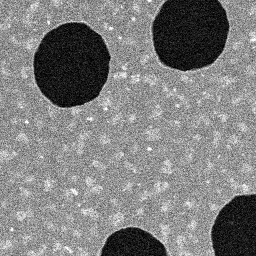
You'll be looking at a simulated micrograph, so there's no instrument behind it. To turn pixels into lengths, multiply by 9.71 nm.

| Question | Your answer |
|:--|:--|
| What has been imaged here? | holes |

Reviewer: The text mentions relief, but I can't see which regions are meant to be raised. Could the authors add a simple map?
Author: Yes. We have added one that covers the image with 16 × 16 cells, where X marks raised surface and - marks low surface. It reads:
XXXXXXXXXX----XX
XXXX-XXXXX----XX
XXX---XXXX----XX
XX-----XXX----XX
XX-----XXXXXXXXX
XX----XXXXXXXXXX
XXX--XXXXXXXXXXX
XXXXXXXXXXXXXXXX
XXXXXXXXXXXXXXXX
XXXXXXXXXXXXXXXX
XXXXXXXXXXXXXXXX
XXXXXXXXXXXXXXXX
XXXXXXXXXXXXXX--
XXXXXXXXXXXXXX--
XXXXXXX--XXXX---
XXXXXX----XXX---